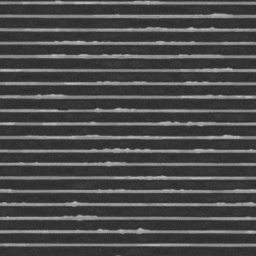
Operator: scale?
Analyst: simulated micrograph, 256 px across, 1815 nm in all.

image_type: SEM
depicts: parallel lines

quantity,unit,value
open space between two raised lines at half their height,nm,74.4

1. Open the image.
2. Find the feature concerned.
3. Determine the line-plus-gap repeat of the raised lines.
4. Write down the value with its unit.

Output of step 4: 0.0954 micrometres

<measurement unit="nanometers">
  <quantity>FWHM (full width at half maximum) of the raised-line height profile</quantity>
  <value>18.6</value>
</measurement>